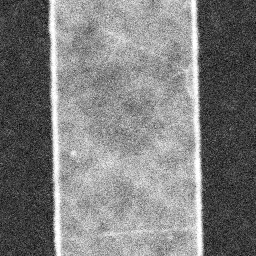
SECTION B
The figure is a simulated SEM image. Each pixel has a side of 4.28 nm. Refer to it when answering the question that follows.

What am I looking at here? one or a few lines or trenches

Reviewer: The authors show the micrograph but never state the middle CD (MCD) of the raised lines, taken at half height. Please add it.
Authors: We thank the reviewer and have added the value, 607 nanometers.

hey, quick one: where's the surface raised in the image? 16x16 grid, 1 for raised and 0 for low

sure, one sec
0001111111110000
0001111111110000
0001111111110000
0001111111110000
0001111111110000
0001111111110000
0001111111110000
0001111111110000
0001111111110000
0000111111110000
0001111111110000
0000111111110000
0000111111110000
0000111111110000
0000111111110000
0000111111110000